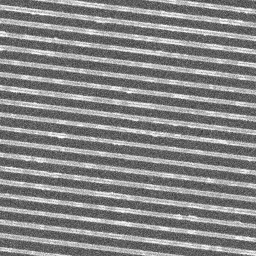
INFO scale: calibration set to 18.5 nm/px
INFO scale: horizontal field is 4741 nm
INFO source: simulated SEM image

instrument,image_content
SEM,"parallel lines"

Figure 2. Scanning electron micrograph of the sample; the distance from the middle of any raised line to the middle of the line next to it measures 247 nm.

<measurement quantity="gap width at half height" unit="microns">0.177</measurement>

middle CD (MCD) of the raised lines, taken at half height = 78.1 nm